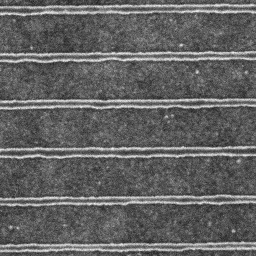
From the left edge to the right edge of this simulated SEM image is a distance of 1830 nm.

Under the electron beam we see lines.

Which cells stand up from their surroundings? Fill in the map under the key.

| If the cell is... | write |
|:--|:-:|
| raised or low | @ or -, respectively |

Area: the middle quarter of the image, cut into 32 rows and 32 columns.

--------------------------------
--------------------------------
--------------------------------
--------------------------------
--------------------------------
--------------------------------
--------------------------------
--------------------------------
--------------------------------
@@@@@@@@@@@@@@@@@@@@@@@@@@@@@@@@
@@@@@@@@@@@@@@@@@@@@@@@@@@@-@@@@
--------------------------------
--------------------------------
--------------------------------
--------------------------------
--------------------------------
--------------------------------
--------------------------------
--------------------------------
--------------------------------
--------------------------------
@@@@@@@@@@@@@@@@@@@@@@@@@@@@@@@@
@@@@@@@@@@@@@@@@@@@@@@@@@@@@@@@@
--------------------------------
--------------------------------
--------------------------------
--------------------------------
--------------------------------
--------------------------------
--------------------------------
--------------------------------
--------------------------------